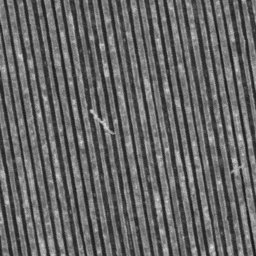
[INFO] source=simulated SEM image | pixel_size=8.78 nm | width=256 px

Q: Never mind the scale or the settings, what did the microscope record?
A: parallel lines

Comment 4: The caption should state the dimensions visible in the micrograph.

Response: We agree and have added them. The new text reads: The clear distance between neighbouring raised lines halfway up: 34.6 nm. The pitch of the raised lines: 9.24 pixels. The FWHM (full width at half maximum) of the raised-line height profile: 0.0433 um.